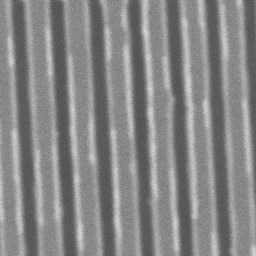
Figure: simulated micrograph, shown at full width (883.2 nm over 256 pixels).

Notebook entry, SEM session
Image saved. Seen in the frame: parallel lines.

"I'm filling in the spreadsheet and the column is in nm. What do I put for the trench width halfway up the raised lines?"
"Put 53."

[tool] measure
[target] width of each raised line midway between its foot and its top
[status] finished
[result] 0.0801 microns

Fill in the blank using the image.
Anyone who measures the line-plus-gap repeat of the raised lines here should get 133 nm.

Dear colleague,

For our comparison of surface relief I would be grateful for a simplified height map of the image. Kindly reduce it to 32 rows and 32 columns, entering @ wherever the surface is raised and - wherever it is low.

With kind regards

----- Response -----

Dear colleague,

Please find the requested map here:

@--@@@--@@@--@@@--@@@--@@--@@@--
@--@@@--@@@--@@@--@@@--@@--@@@--
@--@@@--@@@--@@@--@@@--@@@--@@--
@--@@@--@@@--@@@--@@@--@@@--@@--
@@-@@@--@@@--@@@--@@@--@@@--@@--
@@-@@@--@@@--@@@--@@@--@@@--@@@-
@@--@@--@@@--@@@--@@@--@@@--@@@-
@@--@@@--@@--@@@--@@@--@@@--@@--
@@--@@@--@@--@@@--@@@--@@@--@@@-
@@--@@@--@@--@@@--@@@--@@@--@@@-
@@--@@@--@@---@@--@@@--@@@--@@@-
@@--@@@--@@@--@@@--@@--@@@--@@@-
@@--@@@--@@@--@@@-@@@@-@@@--@@@-
@@--@@@--@@@--@@---@@--@@@--@@@-
@@--@@@--@@@--@@@--@@--@@@--@@@-
@@--@@@--@@@--@@@--@@@-@@@--@@@-
@@--@@@--@@@--@@@--@@---@@--@@@-
@@--@@@--@@@--@@@--@@---@@--@@@-
@@--@@@--@@@--@@@--@@@--@@--@@@-
@@--@@@--@@@--@@@--@@@--@@--@@@-
@@--@@@--@@@--@@@--@@@--@@@--@@-
@@--@@@--@@@--@@@--@@@--@@@--@@-
@@@-@@@--@@@--@@@--@@@--@@@--@@@
@@@-@@@--@@@--@@@--@@@--@@@--@@@
@@@--@@--@@@--@@@--@@@--@@@--@@@
@@@--@@---@@--@@@--@@@--@@@--@@@
@@@--@@@--@@--@@@--@@@--@@@--@@@
@@@--@@@--@@--@@@--@@@--@@@--@@@
@@@--@@@--@@@--@@--@@@--@@@--@@@
@@@--@@@--@@@--@@--@@@--@@@--@@@
@@@--@@@--@@@--@@--@@@--@@@--@@@
@@@--@@@--@@@--@@@--@@--@@@--@@@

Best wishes